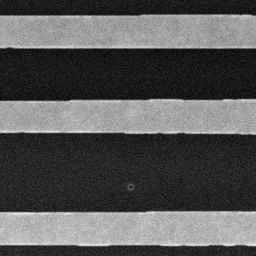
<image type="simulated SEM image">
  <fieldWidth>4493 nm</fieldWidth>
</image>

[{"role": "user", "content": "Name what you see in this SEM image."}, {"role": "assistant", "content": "lines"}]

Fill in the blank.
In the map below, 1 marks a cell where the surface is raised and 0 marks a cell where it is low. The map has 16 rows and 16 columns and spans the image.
0000000000000000
1111111111111111
1111111111111111
0000000000000000
0000000000000000
0000000000000000
1111111111111111
1111111111111111
0000000000000000
0000000000000000
0000000000000000
0000000000000000
0000000000000000
1111111111111111
1111111111111111
0000000000000000